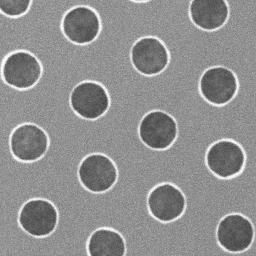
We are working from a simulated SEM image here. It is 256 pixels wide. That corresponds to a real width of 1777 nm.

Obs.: a regular array of holes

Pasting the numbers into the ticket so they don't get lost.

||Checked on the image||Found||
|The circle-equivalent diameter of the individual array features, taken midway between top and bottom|258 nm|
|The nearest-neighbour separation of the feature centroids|509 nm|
